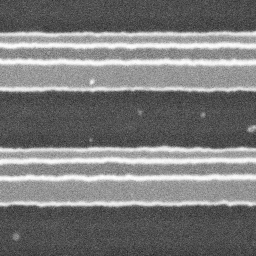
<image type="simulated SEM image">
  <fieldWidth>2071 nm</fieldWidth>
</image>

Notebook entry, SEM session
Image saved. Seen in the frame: lines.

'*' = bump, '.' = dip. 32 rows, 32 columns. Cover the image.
................................
................................
................................
................................
********************************
********************************
********************************
********************************
********************************
********************************
********************************
................................
................................
................................
................................
................................
................................
................................
................................
********************************
********************************
********************************
********************************
********************************
********************************
*....*...............*.........*
................................
................................
................................
................................
................................
................................